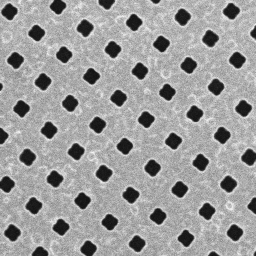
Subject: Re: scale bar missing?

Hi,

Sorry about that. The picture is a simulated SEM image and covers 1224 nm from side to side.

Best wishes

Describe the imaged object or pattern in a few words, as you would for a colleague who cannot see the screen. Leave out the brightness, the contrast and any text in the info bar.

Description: a regular array of holes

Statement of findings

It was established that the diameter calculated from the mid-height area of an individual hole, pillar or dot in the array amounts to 71.7 nanometers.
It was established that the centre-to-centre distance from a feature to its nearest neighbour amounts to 0.164 µm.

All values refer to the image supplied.